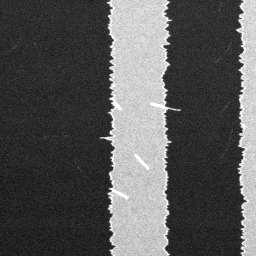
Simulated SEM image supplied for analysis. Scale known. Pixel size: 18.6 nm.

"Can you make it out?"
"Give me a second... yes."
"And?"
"one or a few lines or trenches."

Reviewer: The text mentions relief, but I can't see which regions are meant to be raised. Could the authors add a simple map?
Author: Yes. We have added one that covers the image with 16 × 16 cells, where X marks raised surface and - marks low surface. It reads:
-------XXX-----X
-------XXX-----X
-------XXX-----X
-------XXX-----X
-------XXX-----X
-------XXX-----X
-------XXX-----X
-------XXX-----X
-------XXX-----X
-------XXX-----X
-------XXX-----X
-------XXX-----X
-------XXX-----X
-------XXX-----X
-------XXX-----X
-------XXX-----X